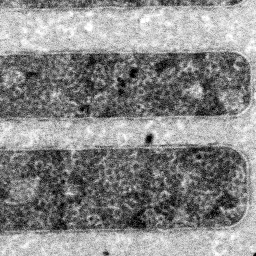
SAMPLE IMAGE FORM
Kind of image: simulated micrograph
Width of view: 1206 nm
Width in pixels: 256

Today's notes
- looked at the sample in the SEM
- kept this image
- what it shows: one or a few lines or trenches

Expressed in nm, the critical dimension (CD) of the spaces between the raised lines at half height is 206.